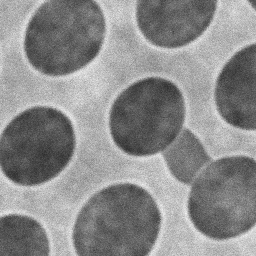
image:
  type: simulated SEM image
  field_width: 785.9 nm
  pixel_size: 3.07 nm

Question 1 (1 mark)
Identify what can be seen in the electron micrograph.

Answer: holes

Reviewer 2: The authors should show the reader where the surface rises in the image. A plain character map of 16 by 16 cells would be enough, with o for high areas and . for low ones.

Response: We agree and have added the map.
oo....ooo.....oo
oo.....oo....ooo
oo....ooo...oooo
oo....ooooooooo.
oo...ooooooooo..
oooooooo...oo...
ooooooo.....o...
o...ooo.....oo..
.....oo.....oooo
.....ooo.....ooo
....oooooo......
o..oooo.oooo....
oooooo....oo....
..ooo.....oo....
...oo.....ooo..o
...oo.....oooooo